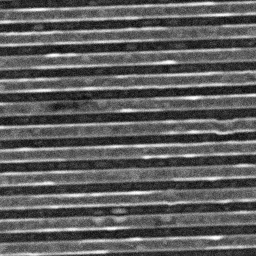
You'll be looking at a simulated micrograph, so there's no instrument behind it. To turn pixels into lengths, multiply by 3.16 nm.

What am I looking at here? parallel lines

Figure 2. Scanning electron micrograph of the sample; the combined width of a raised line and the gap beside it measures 73.5 nanometres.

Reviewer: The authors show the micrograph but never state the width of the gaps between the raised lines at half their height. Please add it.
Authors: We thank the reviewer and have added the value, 31.9 nm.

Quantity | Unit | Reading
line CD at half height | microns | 0.0426